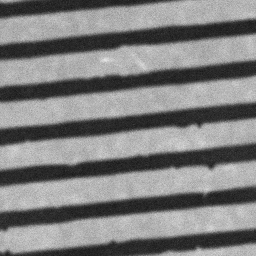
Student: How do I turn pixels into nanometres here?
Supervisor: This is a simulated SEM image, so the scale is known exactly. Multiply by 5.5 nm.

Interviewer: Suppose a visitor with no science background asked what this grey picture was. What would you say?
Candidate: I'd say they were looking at parallel lines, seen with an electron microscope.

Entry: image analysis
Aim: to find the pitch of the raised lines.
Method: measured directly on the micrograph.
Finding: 230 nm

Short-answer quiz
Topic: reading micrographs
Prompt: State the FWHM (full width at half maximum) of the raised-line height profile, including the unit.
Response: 140 nanometers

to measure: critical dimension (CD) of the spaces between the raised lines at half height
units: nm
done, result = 89.5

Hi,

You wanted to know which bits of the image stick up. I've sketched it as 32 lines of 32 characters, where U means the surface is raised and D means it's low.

DDDDDDDDDDDDDDDDDDDUUUUUUUUUUUUU
DDDDDDDDDUUUUUUUUUUUUUUUUUUUUUUU
UUUUUUUUUUUUUUUUUUUUUUUUUUUUUUDD
UUUUUUUUUUUUUUUUUUUDDDDDDDDDDDDD
UUUUUUUUUDDDDDDDDDDDDDDDDDDDDDUU
UDDDDDDDDDDDDDDDDDDDDUUUUUUUUUUU
DDDDDDDDDDDUUUUUUUUUUUUUUUUUUUUU
DUUUUUUUUUUUUUUUUUUUUUUUUUUUUUUD
UUUUUUUUUUUUUUUUUUUUUUUUDDDDDDDD
UUUUUUUUUUUUUDDDDDDDDDDDDDDDDDDD
UUUUDDDDDDDDDDDDDDDDDDDUUUUUUUUU
DDDDDDDDDDDDDDUUUUUUUUUUUUUUUUUU
DDDDUUUUUUUUUUUUUUUUUUUUUUUUUUUU
UUUUUUUUUUUUUUUUUUUUUUUUDDDDDDDD
UUUUUUUUUUUUUUUUDDDDDDDDDDDDDDDD
UUUUUUUDDDDDDDDDDDDDDDDDDDUUUUUU
DDDDDDDDDDDDDDDDUUUUUUUUUUUUUUUU
DDDDDDUUUUUUUUUUUUUUUUUUUUUUUUUU
UUUUUUUUUUUUUUUUUUUUUUUUUUDDDDDD
UUUUUUUUUUUUUUUUUDDDDDDDDDDDDDDD
UUUUUUUUUUDDDDDDDDDDDDDDDDDDDUUU
DDDDDDDDDDDDDDDDDUUUUUUUUUUUUUUU
DDDDDDDUUUUUUUUUUUUUUUUUUUUUUUUU
UUUUUUUUUUUUUUUUUUUUUUUUUUUUUDDD
UUUUUUUUUUUUUUUUUUUUDDDDDDDDDDDD
UUUUUUUUUUUDDDDDDDDDDDDDDDDDDDUU
DDDDDDDDDDDDDDDDDDDDUUUUUUUUUUUU
DDDDDDDDDDUUUUUUUUUUUUUUUUUUUUUU
DDUUUUUUUUUUUUUUUUUUUUUUUUUUUUUU
UUUUUUUUUUUUUUUUUUUUUUDDDDDDDDDD
UUUUUUUUUUUUUDDDDDDDDDDDDDDDDDDU
DUUDDDDDDDDDDDDDDDDDDUDUUUUUUUUU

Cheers